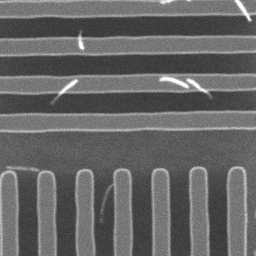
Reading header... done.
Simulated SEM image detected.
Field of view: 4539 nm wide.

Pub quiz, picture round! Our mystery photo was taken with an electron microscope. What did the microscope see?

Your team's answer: groups of lines, slits or small figures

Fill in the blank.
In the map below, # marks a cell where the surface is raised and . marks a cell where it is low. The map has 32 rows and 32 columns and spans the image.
################################
################################
................................
................................
.....................##..#####..
################################
################################
................................
................................
.........#######################
################################
##############..................
................................
................................
################################
################################
................................
................................
................................
................................
................................
.....#....#....#...##...##...##.
##...##...##..##...##...##..###.
##...##..###..##...##...##..###.
##...##..###..##...##...##..###.
##...##...##..##...##...##...##.
##...##...##..##...##...##...##.
##...##...##..##...##...##...##.
##...##...##..##...##...##...##.
##...##...##..##...##...##...##.
##...##...##..##...##...##...##.
##...##...##..##...##...##...##.